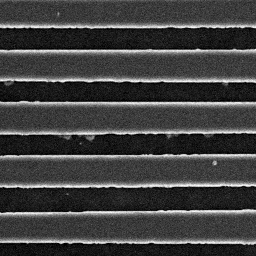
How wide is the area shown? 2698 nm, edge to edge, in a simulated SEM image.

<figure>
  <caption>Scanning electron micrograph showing lines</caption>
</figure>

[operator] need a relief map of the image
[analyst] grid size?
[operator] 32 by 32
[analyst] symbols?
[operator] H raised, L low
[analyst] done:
HHHHHHHHHHHHHHHHHHHHHHHHHHHHHHHH
HHHHHHHHHHHHHHHHHHHHHHHHHHHHHHHH
HHHHHHHHHHHHHHHHHHHHHHHHHHHHHHHH
LLLLLLLLLLLLLLLLLLLLLLLLLLLLLLLL
LLLLLLLLLLLLLLLLLLLLLLLLLLLLLLLL
LLLLLLLLLLLLLLLLLLLLLLLLLLLLLLLL
HHHHHHHHHHHHHHHHHHHHHHHHHHHHHHHH
HHHHHHHHHHHHHHHHHHHHHHHHHHHHHHHH
HHHHHHHHHHHHHHHHHHHHHHHHHHHHHHHH
HHHHHHHHHHHHHHHHHHHHHHHHHHHHHHHH
LLLLLLLLLLLLLLLLLLLLLLLLLLLLLLLL
LLLLLLLLLLLLLLLLLLLLLLLLLLLLLLLL
LLLLLLLLLLLLLLLLLLLLLLLLLLLLLLLL
HHHHHHHHHHHHHHHHHHHHHHHHHHHHHHHH
HHHHHHHHHHHHHHHHHHHHHHHHHHHHHHHH
HHHHHHHHHHHHHHHHHHHHHHHHHHHHHHHH
HHHHHHHHHHHHHHHHHHHHHHHHHHHHHHHH
LLLLLLLLLLLLLLLLLLLLLLLLLLLLLLLL
LLLLLLLLLLLLLLLLLLLLLLLLLLLLLLLL
HHHHHHHHHHHHHHHHHHHHHHHHHHHHHHHH
HHHHHHHHHHHHHHHHHHHHHHHHHHHHHHHH
HHHHHHHHHHHHHHHHHHHHHHHHHHHHHHHH
HHHHHHHHHHHHHHHHHHHHHHHHHHHHHHHH
LLLLLLLLLLLLLLLLLLLLLLLLLLLLLLLL
LLLLLLLLLLLLLLLLLLLLLLLLLLLLLLLL
LLLLLLLLLLLLLLLLLLLLLLLLLLLLLLLL
LLLLLLLLLLLHHHHHHHHHHHHHHHHHHHHH
HHHHHHHHHHHHHHHHHHHHHHHHHHHHHHHH
HHHHHHHHHHHHHHHHHHHHHHHHHHHHHHHH
HHHHHHHHHHHHHHHHHHHHHHHHHHHHHHHH
LLLLLLLLLLLLLLLLLLLLLLLLLLLLLLLL
LLLLLLLLLLLLLLLLLLLLLLLLLLLLLLLL